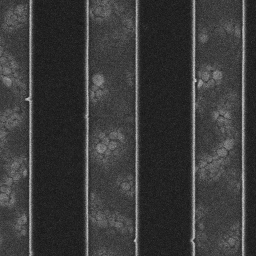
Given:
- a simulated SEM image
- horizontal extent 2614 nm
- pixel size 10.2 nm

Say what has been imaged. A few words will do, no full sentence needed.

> one or a few lines or trenches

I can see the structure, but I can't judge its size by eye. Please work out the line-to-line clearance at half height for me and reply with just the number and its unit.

492 nanometres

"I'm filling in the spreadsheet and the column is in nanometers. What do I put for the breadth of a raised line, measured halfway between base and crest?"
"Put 589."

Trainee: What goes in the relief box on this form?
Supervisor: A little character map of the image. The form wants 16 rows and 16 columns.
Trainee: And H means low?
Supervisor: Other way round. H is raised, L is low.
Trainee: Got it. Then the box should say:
LLHHHLLLLHHHLLLH
LLHHHHLLLHHHLLLH
LLHHHHLLLHHHLLLH
LLHHHLLLLHHHLLLH
LLHHHLLLLHHHLLLH
LLHHHLLLLHHHLLLH
LLHHHLLLLHHHLLLH
LLHHHLLLLHHHLLLH
LLHHHLLLLHHHLLLH
LLHHHLLLLHHHLLLH
LLHHHLLLLHHHLLLH
LLHHHLLLLHHHLLLH
LLHHHLLLLHHHLLLH
LLHHHLLLLHHHLLLH
LLHHHLLLHHHHLLLH
LLHHHLLLHHHHLLLH